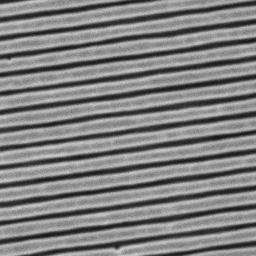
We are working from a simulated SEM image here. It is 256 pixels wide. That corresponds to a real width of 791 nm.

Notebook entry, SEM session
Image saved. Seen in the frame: parallel lines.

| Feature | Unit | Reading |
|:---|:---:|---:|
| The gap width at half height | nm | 19.5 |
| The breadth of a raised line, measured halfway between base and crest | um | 0.0363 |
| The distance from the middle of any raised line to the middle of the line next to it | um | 0.0566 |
